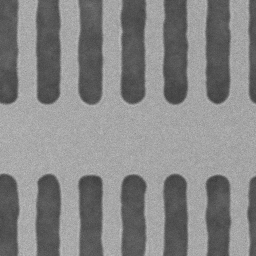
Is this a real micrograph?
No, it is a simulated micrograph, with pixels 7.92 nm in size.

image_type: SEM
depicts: groups of lines, slits or small figures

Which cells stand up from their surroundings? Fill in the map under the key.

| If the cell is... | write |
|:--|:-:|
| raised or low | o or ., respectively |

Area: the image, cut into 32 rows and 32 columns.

..ooo...oo...oo...oo...ooo...oo.
..oo....oo...oo...oo....oo...oo.
..oo....oo...oo...oo....oo...oo.
..oo....oo...oo...oo....oo...oo.
..oo....oo...oo...oo....oo...oo.
..oo....oo...oo...oo....oo...oo.
..oo....oo...oo...oo....oo...oo.
..oo....oo...oo...oo....oo...oo.
..oo....oo...oo...oo....oo...oo.
..oo....oo...oo...oo....oo...oo.
..oo....oo...oo...oo....oo...oo.
..oo....oo...oo...oo....oo...oo.
..ooo..ooo...oo...ooo..ooo..ooo.
oooooooooooooooooooooooooooooooo
oooooooooooooooooooooooooooooooo
oooooooooooooooooooooooooooooooo
oooooooooooooooooooooooooooooooo
oooooooooooooooooooooooooooooooo
oooooooooooooooooooooooooooooooo
oooooooooooooooooooooooooooooooo
oooooooooooooooooooooooooooooooo
oooooooooooooooooooooooooooooooo
..ooo..ooo...oo...ooo..ooo...oo.
..ooo...oo...oo...oo...ooo...oo.
..ooo...oo...oo...oo...ooo...oo.
..oo....oo...oo...oo....oo...oo.
..oo....oo...oo...oo....oo...oo.
..oo....oo...oo...oo....oo...oo.
..oo....oo...oo...oo....oo...oo.
..oo....oo...oo...oo....oo...oo.
..oo....oo...oo...oo....oo...oo.
..oo....oo...oo...oo....oo...oo.